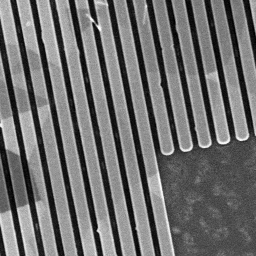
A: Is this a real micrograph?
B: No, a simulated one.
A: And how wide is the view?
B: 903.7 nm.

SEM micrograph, parallel lines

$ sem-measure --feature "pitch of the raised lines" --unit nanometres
67.3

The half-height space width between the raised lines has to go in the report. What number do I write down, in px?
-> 6.88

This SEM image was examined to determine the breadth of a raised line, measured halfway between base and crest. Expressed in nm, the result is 42.5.